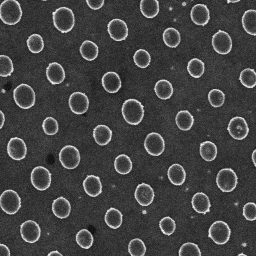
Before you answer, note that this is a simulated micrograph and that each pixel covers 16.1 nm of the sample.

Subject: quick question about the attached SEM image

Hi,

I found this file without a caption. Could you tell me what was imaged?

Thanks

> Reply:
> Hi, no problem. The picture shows a regular array of raised bodies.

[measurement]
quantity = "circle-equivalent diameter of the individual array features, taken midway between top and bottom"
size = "0.319 micrometres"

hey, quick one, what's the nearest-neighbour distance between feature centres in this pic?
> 586 nm